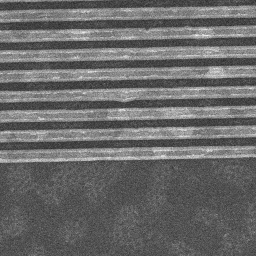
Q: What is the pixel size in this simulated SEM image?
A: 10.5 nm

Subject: parallel lines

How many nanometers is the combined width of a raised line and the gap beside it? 210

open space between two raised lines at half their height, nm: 116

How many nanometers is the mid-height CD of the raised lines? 93.4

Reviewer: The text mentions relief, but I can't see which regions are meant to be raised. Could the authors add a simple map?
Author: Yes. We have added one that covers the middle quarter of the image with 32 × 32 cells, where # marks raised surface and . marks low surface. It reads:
................................
..............##################
################################
##############..................
................................
................................
.............###################
################################
######################..........
................................
................................
...........#####################
################################
#######################.........
................................
................................
.............#.....#############
################################
#####################...........
................................
................................
.......##.....##################
################################
###################.............
................................
................................
................................
................................
................................
................................
................................
................................